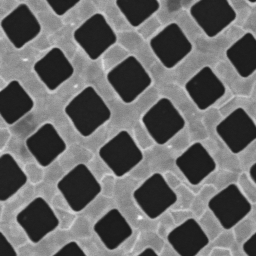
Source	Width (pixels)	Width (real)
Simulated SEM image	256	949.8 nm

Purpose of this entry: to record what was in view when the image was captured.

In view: a regular array of holes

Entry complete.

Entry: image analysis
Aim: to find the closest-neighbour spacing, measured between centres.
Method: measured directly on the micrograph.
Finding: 0.196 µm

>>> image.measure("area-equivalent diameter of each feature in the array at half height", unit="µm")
0.141